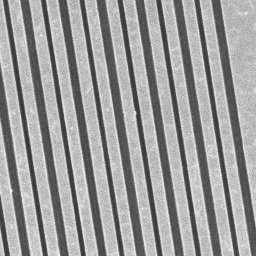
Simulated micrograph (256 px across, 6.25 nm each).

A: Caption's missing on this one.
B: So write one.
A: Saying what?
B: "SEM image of parallel lines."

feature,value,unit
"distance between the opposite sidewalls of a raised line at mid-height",78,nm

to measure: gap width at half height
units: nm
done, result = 47.9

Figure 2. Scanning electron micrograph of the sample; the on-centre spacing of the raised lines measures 118 nm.